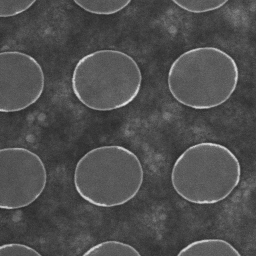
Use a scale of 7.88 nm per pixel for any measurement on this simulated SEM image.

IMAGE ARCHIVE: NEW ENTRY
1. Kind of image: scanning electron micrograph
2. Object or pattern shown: raised bodies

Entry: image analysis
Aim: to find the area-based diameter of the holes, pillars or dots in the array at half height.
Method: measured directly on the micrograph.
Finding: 506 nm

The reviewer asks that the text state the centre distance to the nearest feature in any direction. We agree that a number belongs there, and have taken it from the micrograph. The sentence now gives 755 nanometers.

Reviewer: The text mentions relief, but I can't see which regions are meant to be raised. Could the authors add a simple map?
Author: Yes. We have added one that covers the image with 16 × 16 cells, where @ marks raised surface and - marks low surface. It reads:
@@---@@@---@@---
----------------
----------------
@@---@@@---@@@--
@@@--@@@@--@@@@-
@@@--@@@@--@@@@-
@@---@@@----@@--
----------------
----------------
@@----@@----@@--
@@@--@@@@--@@@@-
@@@--@@@@--@@@@-
@@---@@@----@@--
----------------
----------------
@@----@@----@@@-